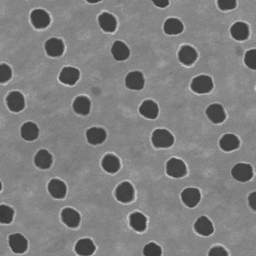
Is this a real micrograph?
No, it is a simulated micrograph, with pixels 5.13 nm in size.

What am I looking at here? a regular array of holes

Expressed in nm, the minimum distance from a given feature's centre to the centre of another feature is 164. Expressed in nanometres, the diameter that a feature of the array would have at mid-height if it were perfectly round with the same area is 101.